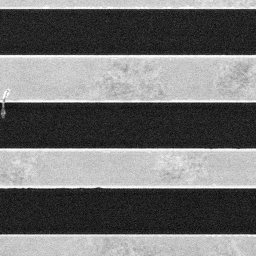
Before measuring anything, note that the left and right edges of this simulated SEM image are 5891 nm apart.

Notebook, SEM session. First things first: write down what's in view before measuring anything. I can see lines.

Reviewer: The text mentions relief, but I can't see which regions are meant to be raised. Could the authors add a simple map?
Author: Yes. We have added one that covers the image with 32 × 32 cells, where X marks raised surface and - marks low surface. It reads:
XXXXXXXXXXXXXXXXXXXXXXXXXXXXXXXX
--------------------------------
--------------------------------
--------------------------------
--------------------------------
--------------------------------
--------------------------------
XXXXXXXXXXXXXXXXXXXXXXXXXXXXXXXX
XXXXXXXXXXXXXXXXXXXXXXXXXXXXXXXX
XXXXXXXXXXXXXXXXXXXXXXXXXXXXXXXX
XXXXXXXXXXXXXXXXXXXXXXXXXXXXXXXX
XXXXXXXXXXXXXXXXXXXXXXXXXXXXXXXX
XXXXXXXXXXXXXXXXXXXXXXXXXXXXXXXX
--------------------------------
--------------------------------
--------------------------------
--------------------------------
--------------------------------
--------------------------------
XXXXXXXXXXXXXXXXXXXXXXXXXXXXXXXX
XXXXXXXXXXXXXXXXXXXXXXXXXXXXXXXX
XXXXXXXXXXXXXXXXXXXXXXXXXXXXXXXX
XXXXXXXXXXXXXXXXXXXXXXXXXXXXXXXX
--------------------------------
--------------------------------
--------------------------------
--------------------------------
--------------------------------
--------------------------------
XXXXXXXXXXXXXXXXXXXXXXXXXXXXXXXX
XXXXXXXXXXXXXXXXXXXXXXXXXXXXXXXX
XXXXXXXXXXXXXXXXXXXXXXXXXXXXXXXX